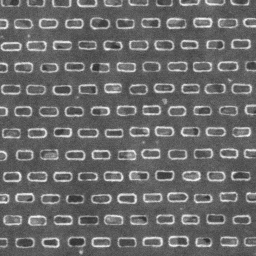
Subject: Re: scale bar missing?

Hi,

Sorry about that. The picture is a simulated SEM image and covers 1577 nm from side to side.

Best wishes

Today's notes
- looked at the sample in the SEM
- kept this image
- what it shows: a regular array of raised bodies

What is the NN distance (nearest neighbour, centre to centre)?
152 nanometres